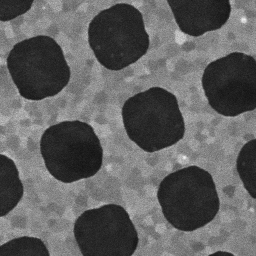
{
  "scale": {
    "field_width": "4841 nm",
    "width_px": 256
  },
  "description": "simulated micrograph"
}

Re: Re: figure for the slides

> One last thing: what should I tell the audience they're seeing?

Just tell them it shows holes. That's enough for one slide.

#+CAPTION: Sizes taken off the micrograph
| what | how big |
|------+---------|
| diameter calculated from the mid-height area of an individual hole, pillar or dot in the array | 1190 nm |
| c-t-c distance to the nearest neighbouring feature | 1630 nanometers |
